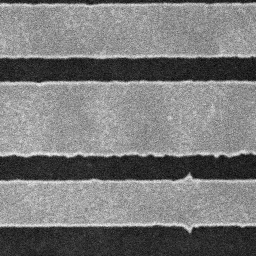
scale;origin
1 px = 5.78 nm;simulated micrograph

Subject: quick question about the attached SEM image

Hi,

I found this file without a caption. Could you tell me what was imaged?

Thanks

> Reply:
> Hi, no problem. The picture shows one or a few lines or trenches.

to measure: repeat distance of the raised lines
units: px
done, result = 86.2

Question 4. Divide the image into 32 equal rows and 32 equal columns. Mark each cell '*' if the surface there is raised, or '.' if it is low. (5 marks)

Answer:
....................*...........
********************************
********************************
********************************
********************************
********************************
********************************
................................
................................
................................
********************************
********************************
********************************
********************************
********************************
********************************
********************************
********************************
********************************
........*.......................
................................
................................
.......................**.......
********************************
********************************
********************************
********************************
********************************
.......................*........
................................
................................
................................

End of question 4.